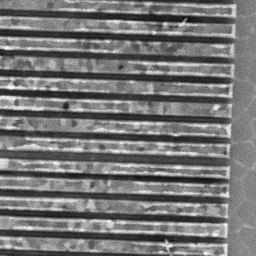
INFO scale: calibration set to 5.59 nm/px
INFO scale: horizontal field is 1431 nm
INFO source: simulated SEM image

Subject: parallel lines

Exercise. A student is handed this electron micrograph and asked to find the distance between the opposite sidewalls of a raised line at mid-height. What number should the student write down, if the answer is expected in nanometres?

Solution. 74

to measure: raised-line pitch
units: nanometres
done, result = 112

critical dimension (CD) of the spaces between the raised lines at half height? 39.8 nm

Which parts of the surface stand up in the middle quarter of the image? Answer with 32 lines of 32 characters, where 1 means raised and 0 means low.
11111111111111111111111111111111
11111111111111111111111111111111
00000000000000000000001111111111
00000000000000000000000000000000
11111111111111111111110000000000
11111111111111111111111111111111
11111111111111111111111111111111
00000000000000000000000001111111
00000000000000000000000000000000
11111111111111111100000000000000
11111111111111111111111111111111
11111111111111111111111111111111
00000000000000000000011111111111
00000000000000000000000000000000
11111111111111111111100000000000
11111111111111111111111111111111
11111111111111111111111111111111
00000000000000000001110001111111
00000000000000000000000000000000
11111111111111111100000000000000
11111111111111111111111111111111
11111111111111111111111111111111
00000000000000000000011111111111
00000000000000000000000000000000
11100000000000000000000000000000
11111111111111111111111111111110
11111111111111111111111111111111
00000000000011111111111111111111
00000000000000000000000000000000
11111111111111111111011000000000
11111111111111111111111111111111
11111111111111111111111111111111